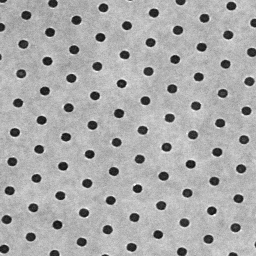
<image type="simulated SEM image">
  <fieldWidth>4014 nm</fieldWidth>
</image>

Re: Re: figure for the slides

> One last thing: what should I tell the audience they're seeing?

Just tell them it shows a regular array of holes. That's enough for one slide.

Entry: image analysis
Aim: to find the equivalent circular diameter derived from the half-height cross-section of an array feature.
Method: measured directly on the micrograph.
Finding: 0.156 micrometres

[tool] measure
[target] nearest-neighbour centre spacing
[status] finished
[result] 454 nm